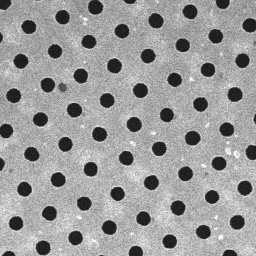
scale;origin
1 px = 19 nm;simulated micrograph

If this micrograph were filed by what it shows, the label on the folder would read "a regular array of holes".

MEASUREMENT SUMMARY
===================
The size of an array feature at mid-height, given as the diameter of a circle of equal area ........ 282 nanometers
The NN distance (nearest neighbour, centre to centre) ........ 0.657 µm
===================